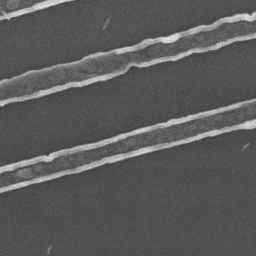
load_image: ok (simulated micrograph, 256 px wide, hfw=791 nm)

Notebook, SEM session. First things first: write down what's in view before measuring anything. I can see one or a few lines or trenches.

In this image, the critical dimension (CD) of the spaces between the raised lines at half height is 181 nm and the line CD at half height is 76.1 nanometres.